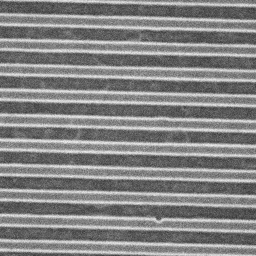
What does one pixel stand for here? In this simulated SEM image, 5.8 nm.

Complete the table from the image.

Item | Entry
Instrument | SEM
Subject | parallel lines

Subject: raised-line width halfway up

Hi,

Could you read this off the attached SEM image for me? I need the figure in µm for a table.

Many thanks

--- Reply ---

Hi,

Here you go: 0.0602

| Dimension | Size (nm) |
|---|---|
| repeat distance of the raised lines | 146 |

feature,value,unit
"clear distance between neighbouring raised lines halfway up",82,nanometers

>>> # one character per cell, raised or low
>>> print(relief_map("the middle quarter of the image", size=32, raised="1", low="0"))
00000000000000000000000000000000
11111111111111111111111111111111
11111111111111111111111111111111
00000000000000000000011111111111
00000000000000000000000000000000
00000000000000000000000000000000
00000000000000000000000000000000
11111111111111111111111100000000
11111111111111111111111111111111
00000000000111111111111111111111
00000000000000000000000000000000
00000000000000000000000000000000
00000000000000000000000000000000
11111111111000000000000000000000
11111111111111111111111111111111
11111111111111111111111111111111
00000000000000000000000000000000
00000000000000000000000000000000
00000000000000000000000000000000
11111111000000000000000000000000
11111111111111111111111111111111
11111111111111111111111111111111
00000000000000000000000011111111
00000000000000000000000000000000
00000000000000000000000000000000
00000000000000000000000000000000
11111111111111111111111111111111
11111111111111111111111111111111
00000000000111111110111111111111
00000000000000000000000000000000
00000000000000000000000000000000
00000000000000000000000000000000